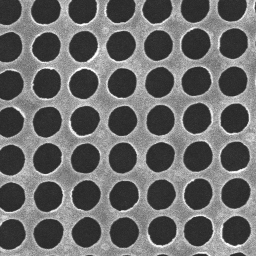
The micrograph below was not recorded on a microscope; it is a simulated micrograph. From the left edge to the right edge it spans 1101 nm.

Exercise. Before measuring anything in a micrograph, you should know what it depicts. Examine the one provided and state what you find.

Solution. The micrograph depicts a regular array of holes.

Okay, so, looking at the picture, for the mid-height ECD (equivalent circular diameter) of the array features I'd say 29.5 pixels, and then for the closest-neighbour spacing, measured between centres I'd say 36.8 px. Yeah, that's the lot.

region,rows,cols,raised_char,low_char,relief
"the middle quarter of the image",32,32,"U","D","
UUUUUUUUUUUUUUUUUUUUUUUUUUUUUUUU
UUUUDDUUUUUUUDDDUUUUUUDDDDUUUUUD
UUDDDDDDUUUUDDDDDDUUUDDDDDDUUUDD
UUDDDDDDUUUDDDDDDDUUUDDDDDDUUUDD
UDDDDDDDDUUDDDDDDDUUDDDDDDDDUDDD
UDDDDDDDUUUDDDDDDDUUDDDDDDDUUUDD
UDDDDDDDUUUDDDDDDDUUUDDDDDDUUUDD
UUDDDDDUUUUUDDDDDUUUUDDDDDUUUUUD
UUUDDDUUUUUUUUDDUUUUUUUDUUUUUUUU
UUUUUUUUUUUUUUUUUUUUUUUUUUUUUUUU
UUUUUDUUUUUUUUDDUUUUUUUDDUUUUUUD
UUUDDDDDUUUUDDDDDUUUUUDDDDDUUUUD
UUDDDDDDDUUUDDDDDDUUUDDDDDDUUUDD
UUDDDDDDDUUDDDDDDDUUUDDDDDDDUUDD
UUDDDDDDDUUDDDDDDDUUUDDDDDDDUUDD
UUDDDDDDUUUDDDDDDDUUUDDDDDDUUUDD
UUDDDDDDUUUUDDDDDUUUUDDDDDDUUUUD
UUUDDDDUUUUUUDDDUUUUUUDDDDUUUUUU
UUUUUUUUUUUUUUUUUUUUUUUUUUUUUUUU
UUUUUUUUUUUUUUUUUUUUUUUUUUUUUUUU
UUUUDDDDUUUUUDDDDUUUUUDDDDDUUUUD
UUUDDDDDDUUUDDDDDDUUUDDDDDDUUUDD
UUDDDDDDDUUDDDDDDDUUUDDDDDDDUUDD
UUDDDDDDDUUDDDDDDDUUDDDDDDDDUUDD
UUDDDDDDDUUDDDDDDDUUUDDDDDDUUUDD
UUDDDDDDUUUUDDDDDDUUUDDDDDDUUUDD
UUUDDDDDUUUUDDDDDUUUUUDDDDUUUUUD
UUUUUDUUUUUUUUUUUUUUUUUUUUUUUUUU
UUUUUUUUUUUUUUUUUUUUUUUUUUUUUUUU
UUUUDDDUUUUUUUDDDUUUUUDDDDUUUUUU
UUUDDDDDUUUUDDDDDDUUUUDDDDDUUUUD
UUDDDDDDDUUUDDDDDDDUUDDDDDDDUUDD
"